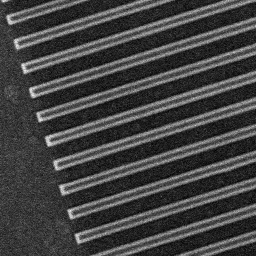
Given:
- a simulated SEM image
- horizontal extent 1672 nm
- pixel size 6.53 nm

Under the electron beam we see parallel lines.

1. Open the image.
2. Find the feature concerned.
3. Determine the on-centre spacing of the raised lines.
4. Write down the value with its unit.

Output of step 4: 166 nanometres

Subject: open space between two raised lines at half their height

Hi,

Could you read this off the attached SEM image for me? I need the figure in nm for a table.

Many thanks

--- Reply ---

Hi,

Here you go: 115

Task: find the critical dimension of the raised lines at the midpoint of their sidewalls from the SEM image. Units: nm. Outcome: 51.4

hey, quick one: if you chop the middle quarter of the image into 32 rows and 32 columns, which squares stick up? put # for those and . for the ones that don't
.........########..............#
......########.............#####
...#######...............#######
#######...............######....
####..............#######.......
#..............#######..........
............#######.............
........########..............##
.....########..............#####
..#######...............#######.
######...............######.....
###...............######........
...............######...........
...........#######..............
........#######..............###
.....#######..............######
..######...............#######..
#####...............######......
##...............######.........
..............######............
..........#######...............
.......#######..............####
....######...............#######
.######...............#######...
####...............######.......
#...............######..........
.............######.............
.........#######..............##
......#######..............#####
...######..............########.
######...............#######....
###..............#######........